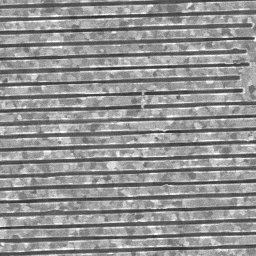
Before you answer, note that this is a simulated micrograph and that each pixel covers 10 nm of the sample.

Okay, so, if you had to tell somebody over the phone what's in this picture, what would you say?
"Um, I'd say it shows parallel lines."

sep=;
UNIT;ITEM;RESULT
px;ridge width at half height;9.37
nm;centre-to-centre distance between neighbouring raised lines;130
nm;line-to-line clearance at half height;37.6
